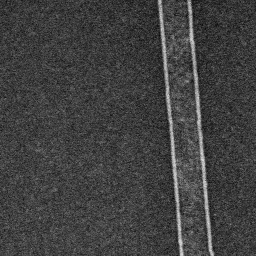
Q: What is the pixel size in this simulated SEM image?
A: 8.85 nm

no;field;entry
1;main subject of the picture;one or a few lines or trenches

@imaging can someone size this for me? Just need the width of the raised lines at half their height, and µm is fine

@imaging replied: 0.263